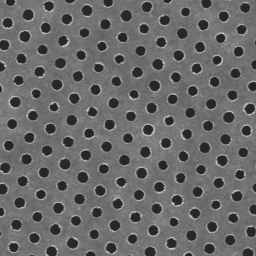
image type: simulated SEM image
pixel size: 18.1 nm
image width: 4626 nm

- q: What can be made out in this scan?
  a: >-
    a regular array of holes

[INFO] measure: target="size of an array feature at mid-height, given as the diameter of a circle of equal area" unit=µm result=0.184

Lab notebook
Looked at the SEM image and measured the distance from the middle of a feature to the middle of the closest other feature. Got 394 nanometres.